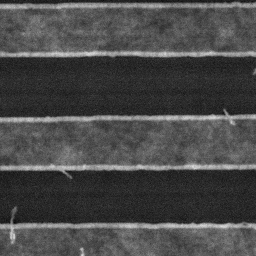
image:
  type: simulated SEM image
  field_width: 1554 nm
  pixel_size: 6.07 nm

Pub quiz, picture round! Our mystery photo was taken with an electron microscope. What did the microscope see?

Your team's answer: lines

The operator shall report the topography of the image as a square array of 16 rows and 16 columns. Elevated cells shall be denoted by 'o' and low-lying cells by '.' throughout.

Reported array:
oooooooooooooooo
oooooooooooooooo
oooooooooooooooo
................
................
................
................
oooooooooooooooo
oooooooooooooooo
oooooooooooooooo
ooooo..o.oo.....
................
................
................
oooooooooooooooo
oooooooooooooooo